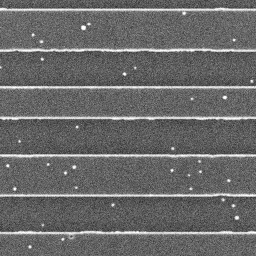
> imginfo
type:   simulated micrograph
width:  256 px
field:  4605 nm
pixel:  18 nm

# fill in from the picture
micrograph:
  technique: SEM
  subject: lines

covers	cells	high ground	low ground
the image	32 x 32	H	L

LLLLLLLLLLLLLLLLLLLLLLLLLLLLLLLL
HHHHHHHHHHHHHHHHHHHHHHHHHHHHHHHH
HHHHHHHHHHHHHHHHHHHHHHHHHHHHHHHH
HHHHHHHHHHHHHHHHHHHHHHHHHHHHHHHH
HHHHHHHHHHHHHHHHHHHHHHHHHHHHHHHH
HHHHHHHHHHHHHHHHHHHHHHHHHHHHHHHH
LLLLLLLLLLLLLLLLLLLLLLLLLLLLLLLL
LLLLLLLLLLLLLLLLLLLLLLLLLLLLLLLL
LLLLLLLLLLLLLLLLLLLLLLLLLLLLLLLL
LLLLLLLLLLLLLLLLLLLLLLLLLLLLLLLL
LLLLLLLLLLLLLLLLLLLLLLLLLLLLLLLL
HHHHHHHHHHHHHHHHHHHHHHHHHHHHHHHH
HHHHHHHHHHHHHHHHHHHHHHHHHHHHHHHH
HHHHHHHHHHHHHHHHHHHHHHHHHHHHHHHH
HHHHHHHHHHHHHHHHHHHHHHHHHHHHHHHH
LLLLLLLLLLLLLLLLLLLLLLLLLLLLLLLL
LLLLLLLLLLLLLLLLLLLLLLLLLLLLLLLL
LLLLLLLLLLLLLLLLLLLLLLLLLLLLLLLL
LLLLLLLLLLLLLLLLLLLLLLLLLLLLLLLL
HHHHHHHHHHHHHHHHHHHHHHHHHHHHHHHH
HHHHHHHHHHHHHHHHHHHHHHHHHHHHHHHH
HHHHHHHHHHHHHHHHHHHHHHHHHHHHHHHH
HHHHHHHHHHHHHHHHHHHHHHHHHHHHHHHH
HHHHHHHHHHHHHHHHHHHHHHHHHHHHHHHH
LLLLLLLLLLLLLLLLLLLLLLLLLLLLLLLL
LLLLLLLLLLLLLLLLLLLLLLLLLLLLLLLL
LLLLLLLLLLLLLLLLLLLLLLLLLLLLLLLL
LLLLLLLLLLLLLLLLLLLLLLLLLLLLLLLL
LLLLLLLLLLLLLLLLLLLLLLLLLLLLLLLL
HHHHHHHHHHHHHHHHHHHHHHHHHHHHHHHH
HHHHHHHHHHHHHHHHHHHHHHHHHHHHHHHH
HHHHHHHHHHHHHHHHHHHHHHHHHHHHHHHH